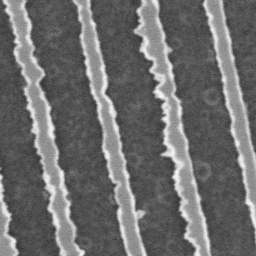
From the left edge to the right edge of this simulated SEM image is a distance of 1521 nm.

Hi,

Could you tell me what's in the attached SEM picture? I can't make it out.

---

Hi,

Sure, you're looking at one or a few lines or trenches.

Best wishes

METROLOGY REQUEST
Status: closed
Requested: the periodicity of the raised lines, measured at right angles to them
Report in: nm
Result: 382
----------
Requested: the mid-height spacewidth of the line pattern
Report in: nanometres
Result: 287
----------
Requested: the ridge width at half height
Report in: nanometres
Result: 95.8